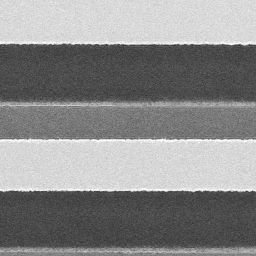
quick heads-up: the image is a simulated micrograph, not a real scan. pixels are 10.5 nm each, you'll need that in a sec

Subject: lines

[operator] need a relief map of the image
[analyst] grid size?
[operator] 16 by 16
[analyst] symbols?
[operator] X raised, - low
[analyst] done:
XXXXXXXXXXXXXXXX
XXXXXXXXXXXXXXXX
XXXXXXXXXXXXXXXX
----------------
----------------
----------------
----------------
XXXXXXXXXXXXXXXX
XXXXXXXXXXXXXXXX
XXXXXXXXXXXXXXXX
XXXXXXXXXXXXXXXX
XXXXXXXXXXXXXXXX
----------------
----------------
----------------
----------------